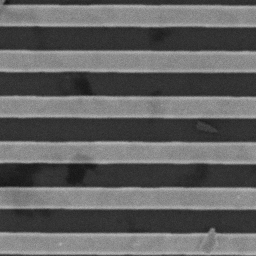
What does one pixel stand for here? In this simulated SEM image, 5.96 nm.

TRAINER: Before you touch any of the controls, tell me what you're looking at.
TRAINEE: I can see wiring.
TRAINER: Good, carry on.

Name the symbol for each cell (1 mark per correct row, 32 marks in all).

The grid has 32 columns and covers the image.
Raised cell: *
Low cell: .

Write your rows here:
*...............................
********************************
********************************
................................
................................
................................
*********..****.................
********************************
********************************
................................
................................
................................
********************************
********************************
********************************
................................
................................
................................
********************************
********************************
................................
................................
................................
****............................
********************************
********************************
................................
................................
................................
********************************
********************************
********************************